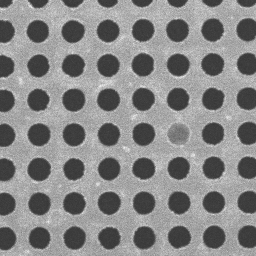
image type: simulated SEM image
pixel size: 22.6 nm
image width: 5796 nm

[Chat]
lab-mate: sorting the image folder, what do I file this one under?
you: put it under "a regular array of holes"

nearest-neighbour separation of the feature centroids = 777 nanometres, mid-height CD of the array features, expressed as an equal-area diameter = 522 nm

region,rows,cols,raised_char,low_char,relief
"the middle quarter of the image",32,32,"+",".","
.....+++......+++......+++.....+
.....+++......+++.....++++.....+
....+++++....+++++...++++++...++
++.+++++++++++++++++++++++++++++
++++++++++++++++++++++++++++++++
++++++++++++++++++++++++++++++++
+...++++++...+++++...++++++...++
.....++++.....+++......+++.....+
.....+++......+++......+++.....+
.....+++......+++......+++.....+
.....++++.....+++.....++++.....+
+...++++++...++++++..++++++..+++
++++++++++++++++++++++++++++++++
++++++++++++++++++++++++++++++++
+++++++++++++++++++.++++++++++++
+...+++++....+++++....++++++++++
.....++++.....+++......+++++++++
.....+++......+++......+++++++++
.....++++.....+++......+++++++++
.....++++....+++++....++++++++++
+...+++++++.++++++++++++++++++++
++++++++++++++++++++++++++++++++
++++++++++++++++++++++++++++++++
++.+++++++..+++++++..+++++++..++
.....++++.....++++....++++.....+
.....++++.....+++......+++......
.....+++......+++......+++.....+
.....++++.....+++......+++.....+
+...++++++...++++++...+++++...++
++++++++++++++++++++++++++++++++
++++++++++++++++++++++++++++++++
++++++++++++++++++++++++++++++++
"